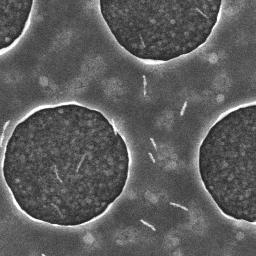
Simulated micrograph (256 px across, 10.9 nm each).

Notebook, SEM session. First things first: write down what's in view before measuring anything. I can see holes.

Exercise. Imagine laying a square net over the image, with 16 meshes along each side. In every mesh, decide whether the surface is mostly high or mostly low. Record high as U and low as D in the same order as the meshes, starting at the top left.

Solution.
DDUUUUDDDDDDDDUU
DDUUUUUDDDDDDUUU
DUUUUUUDDDDDDUUU
UUUUUUUUDDDUUUUU
UUUUUUUUUUUUUUUU
UUUUUUUUUUUUUUUU
UUUUUUUUUUUUUUUU
UDDDDDDUUUUUUUDD
UDDDDDDUUUUUUDDD
DDDDDDDDUUUUDDDD
DDDDDDDDUUUUDDDD
DDDDDDDDUUUUUDDD
UDDDDDDUUUUUUDDD
UUDDDDUUUUUUUUDD
UUUUUUUUUUUUUUUU
UUUUUUUUUUUUUUUU